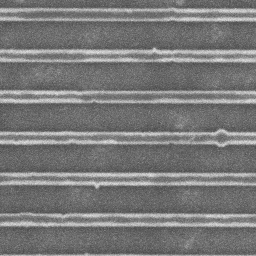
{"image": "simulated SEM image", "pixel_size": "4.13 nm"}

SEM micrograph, parallel lines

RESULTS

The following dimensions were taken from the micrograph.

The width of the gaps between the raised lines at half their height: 0.125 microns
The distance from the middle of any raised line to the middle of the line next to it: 169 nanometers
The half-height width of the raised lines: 46.5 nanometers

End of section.